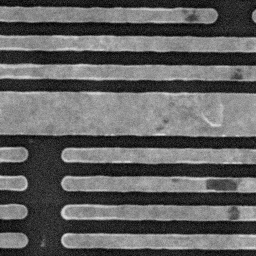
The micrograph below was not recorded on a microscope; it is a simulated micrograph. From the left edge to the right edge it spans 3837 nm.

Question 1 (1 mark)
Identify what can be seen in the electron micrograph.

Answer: groups of lines, slits or small figures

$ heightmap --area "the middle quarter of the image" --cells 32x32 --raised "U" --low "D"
UUUUUUUUUUUUUUUDDDUUUUUUUUDUUUUU
UUUUUUUUUUUUUUUUUUUUUUUUUUUUUUUU
UUUUUUUUUUUUUUUUUUUUUUUUUUUUUUUU
UUUUUUUUUUUUUUUUUUUUUUUUUUUUUUUU
DDDDDDDDDDDDDDDDDDDDDDDDDDDDDDDD
DDDDDDDDDDDDDDDDDDDDDDDDDDDDDDDD
DDDDDDDDDDDDDDDDDDDDDDDDDDDDDDDD
UUUUUUUUUUUUUUUUUUUUUUUUUUUDDUUU
UUUUUUUUUUUUUUUUUUUUUUUUUUUUUUUU
UUUUUUUUUUUUUUUUUUUUUUUUUUUUUUUU
UUUUUUUUUUUUUUUUUUUUUUUUUUUUUUUU
UUUUUUUUUUUUUUUUUUUUUUUUUUUUUUUU
UUUUUUUUUUUUUUUUUUUUUUUUUUUUUUUU
UUUUUUUUUUUUUUUUUUUUUUUUUUUUUUUU
UUUUUUUUUUUUUUUUUUUUUUUUUUUUUUUU
UUUUUUUUUUUUUUUUUUUUUUUUUUUUUUUU
UUUUUUUUUUUUUUUUUUUUUUUUUUUUUUUU
UDDDDDUUUUUUUUUUUUUUUUUUUUUUUUUU
DDDDDDDDDDDDDDDDDDDDDDDDDDDDDDDD
DDDDDDDDDDDDDDDDDDDDDDDDDDDDDDDD
DDDDDDDDDDDDDDDDDDDDDDDDDDDDDDDD
UUUUUUUUUUUUUUUUUUUUUUUUUUUUUUUU
UUUUUUUUUUUUUUUUUUUUUUUUUUUUUUUU
UUUUUUUUUUUUUUUUUUUUUUUUUUUUUUUU
DDDDDDUUUUUUUUUUUUUUUUUUUUUUUUDU
DDDDDDDDDDDDDDDDDDDDDDDDDDDDDDDD
DDDDDDDDDDDDDDDDDDDDDDDDDDDDDDDD
DDDDDDDDDDDDDDDDDDDDDDDDDDDDDDDD
UUUUUUUUUUUUUUUUUUUUUUUUUUUUUUDD
UUUUUUUUUUUUUUUUUUUUUUUUUUUUUUUU
UUUUUUUUUUUUUUUUUUUUUUUUUUUUUUUU
DUUUUUUUUUUUUUUUUUUUUUUUUUUUUUUU